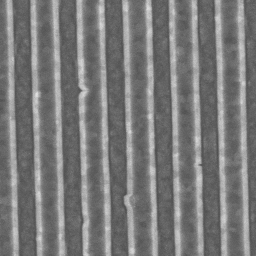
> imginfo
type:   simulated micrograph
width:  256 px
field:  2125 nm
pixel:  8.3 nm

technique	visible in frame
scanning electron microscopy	parallel lines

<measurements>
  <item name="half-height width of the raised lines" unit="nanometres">189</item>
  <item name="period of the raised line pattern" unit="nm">383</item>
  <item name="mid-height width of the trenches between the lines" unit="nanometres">195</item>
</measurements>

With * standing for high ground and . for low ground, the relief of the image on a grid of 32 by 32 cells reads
*...***...***...***...**...***..
*...***...***...***...**...***..
*...***...***...***..***...***..
*...***...***...***..***...***..
*...***...***...***...**...***..
*...***...***...***...**...***..
*...***...***...***...**...***..
*...***...***...***...**...***..
*...***...***...***...**....**..
*...***...***...***...**....**..
*...***...***...***...***...**..
*...***...***...***...***...**..
*...***...***...***...***...**..
*...***...***...***...***...**..
**..***...***...***...***...**..
**..***...***...***...***...**..
**...**...***...***...***...**..
**...**...***...***...***...**..
**...**...***...***...***...**..
**...**...***...***...***...***.
**...**....**...***...***...***.
**...**....**...***...***...***.
**...***...**...***...***...***.
**...***...**...***...***...***.
**...***...**...***...***...***.
**...***...**...***...***...***.
**...***...**...***...***...***.
**...***...**...***...***...***.
**...***...**...***...***...***.
**...***...**...***...***...***.
**...***...**...***...***...***.
**...***...***..***...***...***.